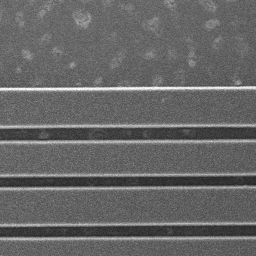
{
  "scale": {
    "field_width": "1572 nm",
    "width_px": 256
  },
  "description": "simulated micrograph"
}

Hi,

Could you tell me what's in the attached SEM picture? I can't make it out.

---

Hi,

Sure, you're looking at parallel lines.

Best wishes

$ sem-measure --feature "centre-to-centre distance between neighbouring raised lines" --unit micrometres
0.303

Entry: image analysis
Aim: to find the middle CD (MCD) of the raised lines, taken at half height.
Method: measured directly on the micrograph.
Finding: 233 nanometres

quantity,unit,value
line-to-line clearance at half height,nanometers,74.5